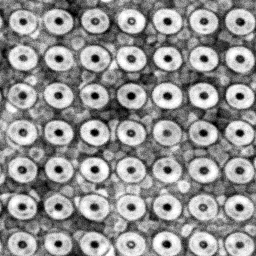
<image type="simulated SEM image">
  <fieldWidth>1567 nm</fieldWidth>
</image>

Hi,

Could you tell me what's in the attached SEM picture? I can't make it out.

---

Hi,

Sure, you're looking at a regular array of ring-shaped raised bodies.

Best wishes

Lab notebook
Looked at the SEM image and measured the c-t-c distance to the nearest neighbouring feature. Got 220 nanometres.